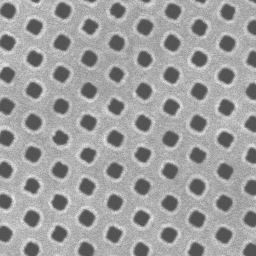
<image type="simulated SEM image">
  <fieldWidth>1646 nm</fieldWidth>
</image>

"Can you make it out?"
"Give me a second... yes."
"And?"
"a regular array of holes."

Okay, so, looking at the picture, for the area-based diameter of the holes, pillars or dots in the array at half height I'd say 96.9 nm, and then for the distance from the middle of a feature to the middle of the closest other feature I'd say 203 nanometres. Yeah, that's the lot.